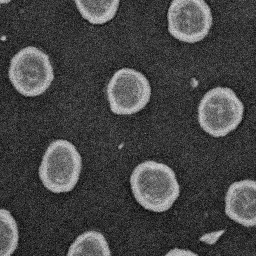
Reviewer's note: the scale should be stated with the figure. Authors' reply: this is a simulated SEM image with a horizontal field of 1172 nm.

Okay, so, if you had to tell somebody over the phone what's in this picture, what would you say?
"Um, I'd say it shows raised bodies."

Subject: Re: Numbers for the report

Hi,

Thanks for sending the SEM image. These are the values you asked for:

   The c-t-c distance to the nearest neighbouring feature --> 0.443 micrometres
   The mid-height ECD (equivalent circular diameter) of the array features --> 194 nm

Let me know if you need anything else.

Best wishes